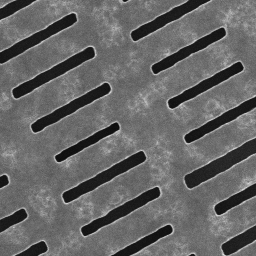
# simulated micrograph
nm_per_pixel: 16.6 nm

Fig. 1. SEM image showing holes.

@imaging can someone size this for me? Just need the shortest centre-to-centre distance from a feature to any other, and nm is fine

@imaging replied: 638